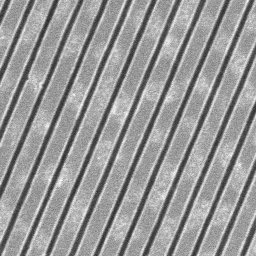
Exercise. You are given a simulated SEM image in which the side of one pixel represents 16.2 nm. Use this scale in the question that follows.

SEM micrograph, parallel lines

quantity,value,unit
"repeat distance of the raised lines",365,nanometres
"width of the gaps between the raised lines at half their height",105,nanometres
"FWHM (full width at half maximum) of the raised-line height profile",0.256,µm